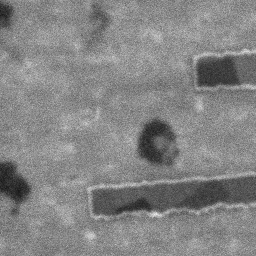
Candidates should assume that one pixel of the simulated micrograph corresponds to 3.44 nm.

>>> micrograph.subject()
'one or a few lines or trenches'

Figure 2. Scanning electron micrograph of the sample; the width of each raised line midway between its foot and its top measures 112 nm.